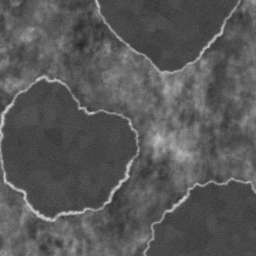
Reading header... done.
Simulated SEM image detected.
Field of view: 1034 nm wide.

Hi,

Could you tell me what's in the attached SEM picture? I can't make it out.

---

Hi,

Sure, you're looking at raised bodies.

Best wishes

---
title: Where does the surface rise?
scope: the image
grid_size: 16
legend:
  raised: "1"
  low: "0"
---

0000001111111110
0000000111111100
0000000011111000
0000000001111000
0000000000100000
0011000000000000
0111100000000000
1111111100000000
1111111110000000
1111111110000000
1111111100000000
0111111100000111
0011111000011111
0011000000111111
0000000000111111
0000000001111111